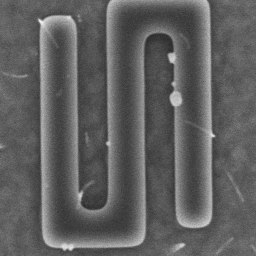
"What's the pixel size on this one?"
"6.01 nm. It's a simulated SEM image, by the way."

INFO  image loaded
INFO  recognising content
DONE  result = groups of lines, slits or small figures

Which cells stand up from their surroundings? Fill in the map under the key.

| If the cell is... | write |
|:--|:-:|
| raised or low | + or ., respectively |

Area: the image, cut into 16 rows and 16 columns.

.......++++++...
...++..++++++...
...++..++..++...
...++..++..++...
...++..++..++...
...++..++..++...
...++..++..++...
...++..++..++...
...++..++..++...
...++..++..++...
...++..++..++...
...++..++..++...
...++..++..++...
...++++++..++...
...++++++.......
....+...........